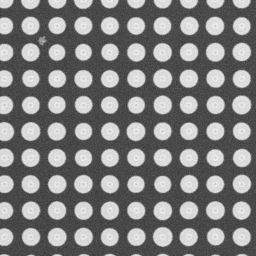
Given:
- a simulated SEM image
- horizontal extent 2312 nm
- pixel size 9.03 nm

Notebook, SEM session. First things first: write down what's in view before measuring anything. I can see an array of small figures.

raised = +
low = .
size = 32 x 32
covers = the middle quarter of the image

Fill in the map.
................................
........................+.......
...++++...+++...++++...++++..+++
...++++..+++++..++++..+++++..+++
...++++...+++...++++..+++++..+++
....++....+++....++....+++....++
................................
................................
....++....+++....++....+++....++
...++++...+++...++++...++++..+++
...++++..++++...++++...++++..+++
...++++...+++...++++...++++..+++
................................
................................
................................
...+++....+++...++++...+++....++
...++++..+++++..++++...++++..+++
...++++...++++..++++...++++..+++
....++....+++...++++...+++....++
................................
................................
...........+.....++.....+.....++
...++++...+++...++++...++++..+++
...++++...++++..++++...++++..+++
...++++...+++...++++...++++..+++
...........+..................++
................................
................................
...+++....+++....++....+++....++
...++++..+++++..++++...++++..+++
...++++..+++++..++++...++++..+++
...+++....+++...+++....+++....++